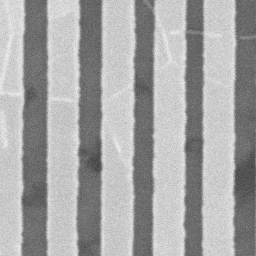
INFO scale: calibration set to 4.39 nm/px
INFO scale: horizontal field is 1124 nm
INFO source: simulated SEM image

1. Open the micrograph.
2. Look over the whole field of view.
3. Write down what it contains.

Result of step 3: lines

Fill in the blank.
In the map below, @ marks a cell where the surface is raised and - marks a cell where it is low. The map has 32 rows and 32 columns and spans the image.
@@@---@@@@---@@@@--@@@@---@@@---
@@@---@@@@---@@@@--@@@@---@@@---
@@@---@@@@---@@@@--@@@@---@@@---
@@@---@@@@---@@@@--@@@@---@@@---
@@@---@@@@---@@@@--@@@@--@@@@---
@@@---@@@@---@@@@--@@@@---@@@---
@@@---@@@@---@@@@--@@@@--@@@@---
@@@---@@@@---@@@@--@@@@---@@@---
@@@---@@@@---@@@@--@@@@--@@@@---
@@@---@@@@---@@@@--@@@@---@@@---
@@@---@@@@---@@@@--@@@@--@@@@---
@@@---@@@@---@@@@--@@@@--@@@@---
@@@---@@@@---@@@@--@@@@--@@@@---
@@@---@@@@---@@@@--@@@@--@@@@---
@@@---@@@@---@@@@--@@@@--@@@@---
@@@---@@@@---@@@@--@@@@--@@@@---
@@@---@@@@---@@@@--@@@@--@@@@---
@@@---@@@@---@@@@--@@@@---@@@---
@@@---@@@@---@@@@--@@@@--@@@@---
@@@---@@@@---@@@@--@@@@--@@@@---
@@@---@@@@---@@@---@@@@--@@@@---
@@@---@@@@---@@@@--@@@@--@@@@---
@@@---@@@@---@@@---@@@@--@@@@---
@@@---@@@@---@@@@--@@@@--@@@@---
@@@---@@@@---@@@@--@@@@--@@@@---
@@@---@@@@---@@@@--@@@@--@@@@---
@@@---@@@@---@@@@--@@@@--@@@@---
@@@---@@@@---@@@@--@@@@--@@@@---
@@@---@@@----@@@@--@@@@--@@@@---
@@@---@@@@---@@@@--@@@@--@@@@---
@@@---@@@@---@@@---@@@@--@@@@---
@@@---@@@@---@@@---@@@@--@@@@---